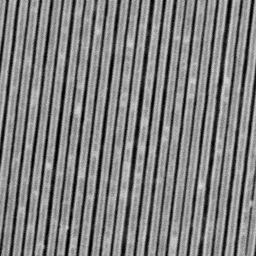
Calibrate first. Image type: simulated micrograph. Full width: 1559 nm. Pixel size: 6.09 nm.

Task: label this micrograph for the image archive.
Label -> parallel lines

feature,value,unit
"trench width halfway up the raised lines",26.4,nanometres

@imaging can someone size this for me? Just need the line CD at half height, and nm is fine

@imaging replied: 41.5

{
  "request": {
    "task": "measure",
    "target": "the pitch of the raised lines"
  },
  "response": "0.0676 microns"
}